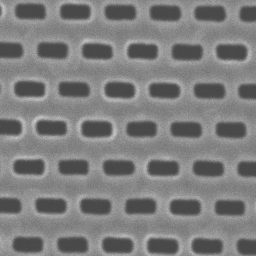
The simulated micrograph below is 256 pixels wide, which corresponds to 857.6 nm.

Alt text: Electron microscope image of a regular array of holes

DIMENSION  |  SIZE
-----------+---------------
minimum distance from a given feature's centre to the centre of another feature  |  149 nanometers